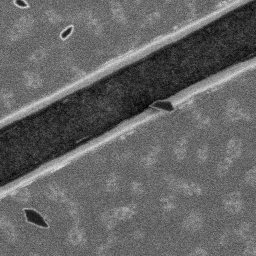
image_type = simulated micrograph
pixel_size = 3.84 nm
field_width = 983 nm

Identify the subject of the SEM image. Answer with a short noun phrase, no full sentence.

one or a few lines or trenches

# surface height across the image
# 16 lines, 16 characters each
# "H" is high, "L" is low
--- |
HHHHHHHHHHHHHHLL
HHHHHHHHHHHHLLLL
HHHHHHHHHHLLLLLL
HHHHHHHHHLLLLLLL
HHHHHHLLLLLLLLHH
HHHHHLLLLLLLHHHH
HHHLLLLLLLHHHHHH
HLLLLLLLLHHHHHHH
LLLLLLLHHHHHHHHH
LLLLLHHHHHHHHHHH
LLLHHHHHHHHHHHHH
LHHHHHHHHHHHHHHH
HHHHHHHHHHHHHHHH
HHHHHHHHHHHHHHHH
HHHHHHHHHHHHHHHH
HHHHHHHHHHHHHHHH